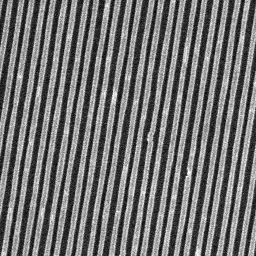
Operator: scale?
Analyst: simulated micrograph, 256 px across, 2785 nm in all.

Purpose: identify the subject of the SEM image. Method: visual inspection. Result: parallel lines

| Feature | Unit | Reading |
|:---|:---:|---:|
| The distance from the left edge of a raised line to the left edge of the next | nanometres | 116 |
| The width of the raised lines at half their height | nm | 56.5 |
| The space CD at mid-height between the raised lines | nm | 57.8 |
